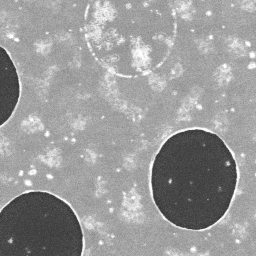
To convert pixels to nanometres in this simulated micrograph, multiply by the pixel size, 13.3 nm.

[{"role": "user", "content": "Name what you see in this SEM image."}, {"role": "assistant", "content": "holes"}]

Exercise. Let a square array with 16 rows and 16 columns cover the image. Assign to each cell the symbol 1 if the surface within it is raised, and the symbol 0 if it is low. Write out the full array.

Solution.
1111111111111111
1111111111111111
1111111111111111
0111111111111111
0111111111111111
0111111111111111
0111111111111111
1111111111111111
1111111111100011
1111111111000011
1111111110000001
1111111110000001
1000111111000011
0000011111000011
0000011111111111
0000011111111111